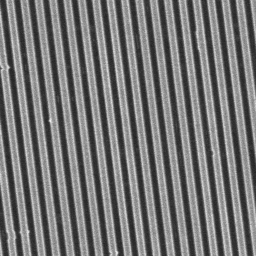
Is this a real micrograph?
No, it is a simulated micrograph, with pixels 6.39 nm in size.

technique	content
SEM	parallel lines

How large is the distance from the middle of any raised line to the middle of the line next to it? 91.1 nanometers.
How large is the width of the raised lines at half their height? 48.3 nm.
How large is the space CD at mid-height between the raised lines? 42 nm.